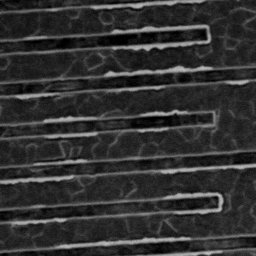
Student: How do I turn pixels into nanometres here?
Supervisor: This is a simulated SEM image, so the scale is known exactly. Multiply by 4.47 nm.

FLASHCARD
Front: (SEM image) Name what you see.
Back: parallel lines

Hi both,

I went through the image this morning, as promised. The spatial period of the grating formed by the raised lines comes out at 188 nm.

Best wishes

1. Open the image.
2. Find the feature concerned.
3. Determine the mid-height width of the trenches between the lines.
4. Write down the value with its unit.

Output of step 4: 55.7 nanometers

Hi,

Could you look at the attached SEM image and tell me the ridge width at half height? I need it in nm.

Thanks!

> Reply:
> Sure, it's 132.